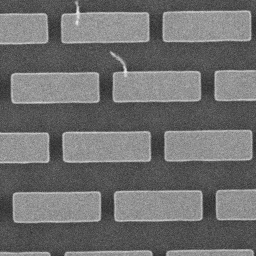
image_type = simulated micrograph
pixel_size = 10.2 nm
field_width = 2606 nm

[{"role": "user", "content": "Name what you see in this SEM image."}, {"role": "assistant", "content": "groups of lines, slits or small figures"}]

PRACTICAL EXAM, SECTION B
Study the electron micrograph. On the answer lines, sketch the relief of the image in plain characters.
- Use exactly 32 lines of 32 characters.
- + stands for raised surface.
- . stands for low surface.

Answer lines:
................................
......................+++++++++.
++++++..+++++++++++.+++++++++++.
++++++..+++++++++++.+++++++++++.
++++++..+++++++++++.+++++++++++.
................................
................................
................................
................................
..++++++++++..+++++++++++..+++++
.+++++++++++..+++++++++++..+++++
.+++++++++++..+++++++++++..+++++
..++++++++++..+++++++++++..+++++
................................
................................
................................
.....................++++++++++.
++++++..+++++++++++..++++++++++.
++++++..+++++++++++..++++++++++.
++++++..+++++++++++..++++++++++.
................................
................................
................................
................................
..+++++++++++.+++++++++++..+++++
..+++++++++++.+++++++++++..+++++
..+++++++++++.+++++++++++..+++++
..++++++++++...++++++...........
................................
................................
................................
............+++++++..+++++++++++